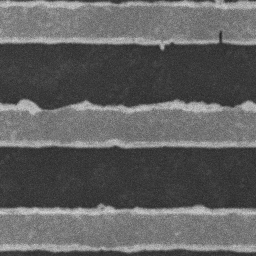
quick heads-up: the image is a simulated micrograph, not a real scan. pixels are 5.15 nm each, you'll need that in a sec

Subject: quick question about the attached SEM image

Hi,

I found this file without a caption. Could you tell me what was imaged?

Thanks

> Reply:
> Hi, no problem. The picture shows one or a few lines or trenches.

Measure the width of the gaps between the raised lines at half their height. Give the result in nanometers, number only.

328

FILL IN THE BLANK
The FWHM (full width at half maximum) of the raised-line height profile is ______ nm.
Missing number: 205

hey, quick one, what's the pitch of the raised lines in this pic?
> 0.532 microns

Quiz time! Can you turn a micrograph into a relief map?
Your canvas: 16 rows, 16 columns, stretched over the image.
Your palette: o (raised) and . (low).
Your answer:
oooooooooooooooo
oooooooooooooooo
oooooooooooooooo
................
................
................
..........ooo...
oooooooooooooooo
oooooooooooooooo
................
................
................
................
oooooooooooooooo
oooooooooooooooo
ooooooooo...oooo